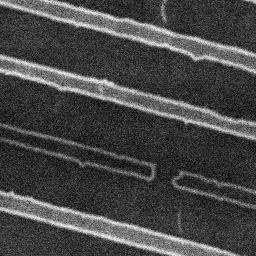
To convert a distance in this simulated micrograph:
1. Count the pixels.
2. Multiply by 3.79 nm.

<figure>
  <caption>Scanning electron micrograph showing one or a few lines or trenches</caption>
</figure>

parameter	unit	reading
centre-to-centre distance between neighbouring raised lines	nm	251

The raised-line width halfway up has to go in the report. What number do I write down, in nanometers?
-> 56.9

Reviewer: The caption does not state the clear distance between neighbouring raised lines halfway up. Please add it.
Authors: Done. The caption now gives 196 nm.